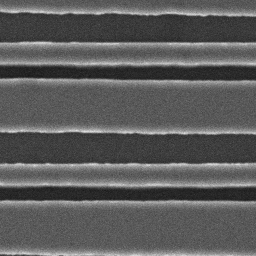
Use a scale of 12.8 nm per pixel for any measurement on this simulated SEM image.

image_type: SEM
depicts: lines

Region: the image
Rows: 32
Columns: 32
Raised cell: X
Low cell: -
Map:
XXXXXXXXXXXXXXXXXXXXXXXXXXXXXXXX
-X--XXXXXXXXXXXXXXXXXXXXXXXXXXXX
--------------------------------
--------------------------------
--------------------------------
XXXXXXXXXXXXXXXXXXXXXXXXXXXXXXXX
XXXXXXXXXXXXXXXXXXXXXXXXXXXXXXXX
XXXXXXXXXXXXXXXXXXXXXXXXXXXXXXXX
--------------------------------
--------------------------------
XXXXXXXXXXXXXXXXXXXXXXXXXXXXXXXX
XXXXXXXXXXXXXXXXXXXXXXXXXXXXXXXX
XXXXXXXXXXXXXXXXXXXXXXXXXXXXXXXX
XXXXXXXXXXXXXXXXXXXXXXXXXXXXXXXX
XXXXXXXXXXXXXXXXXXXXXXXXXXXXXXXX
XXXXXXXXXXXXXXXXXXXXXXXXXXXXXXXX
-X---XXX--XXXXXXXXXXXXXXXXXXXXXX
--------------------------------
--------------------------------
--------------------------------
--X--X-----XX---------XX-XXX-XXX
XXXXXXXXXXXXXXXXXXXXXXXXXXXXXXXX
XXXXXXXXXXXXXXXXXXXXXXXXXXXXXXXX
--------------------------------
--------------------------------
XXXXXXXXXXXXXXXXXXXXXXXXXXXXXXXX
XXXXXXXXXXXXXXXXXXXXXXXXXXXXXXXX
XXXXXXXXXXXXXXXXXXXXXXXXXXXXXXXX
XXXXXXXXXXXXXXXXXXXXXXXXXXXXXXXX
XXXXXXXXXXXXXXXXXXXXXXXXXXXXXXXX
XXXXXXXXXXXXXXXXXXXXXXXXXXXXXXXX
XXXXXXXXXXXXXXXXXXXXXXXXXXXXXXXX